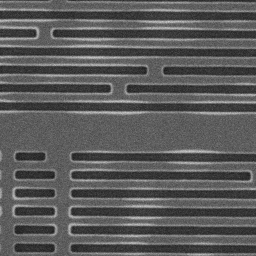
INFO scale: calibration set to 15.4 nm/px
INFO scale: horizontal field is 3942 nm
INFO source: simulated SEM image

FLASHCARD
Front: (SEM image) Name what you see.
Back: groups of lines, slits or small figures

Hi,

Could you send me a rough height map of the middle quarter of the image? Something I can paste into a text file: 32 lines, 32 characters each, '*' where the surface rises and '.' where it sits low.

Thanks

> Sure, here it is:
....................*****.......
.....................****.......
.....................****.......
********************************
********************************
............****................
............***.................
*********..*****..********......
********************************
..................**************
................................
................................
********************************
********************************
********************************
********************************
********************************
********************************
********************************
********************************
********************************
********************************
**..............................
**..............................
*****.......********............
********************************
****.......*********************
**..............................
**..............................
********************************
********************************
**..............................